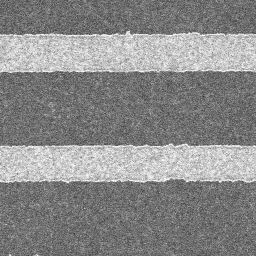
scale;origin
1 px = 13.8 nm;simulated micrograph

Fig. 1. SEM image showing one or a few lines or trenches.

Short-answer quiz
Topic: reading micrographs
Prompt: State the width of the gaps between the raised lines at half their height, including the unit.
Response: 1040 nm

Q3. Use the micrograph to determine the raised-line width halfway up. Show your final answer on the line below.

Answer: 0.488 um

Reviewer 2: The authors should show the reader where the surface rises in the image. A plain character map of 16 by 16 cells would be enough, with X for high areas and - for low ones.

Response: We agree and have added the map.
----------------
----------------
XXXXXXXXXXXXXXXX
XXXXXXXXXXXXXXXX
----------------
----------------
----------------
----------------
----------------
XXXXXXXXXXXXXXXX
XXXXXXXXXXXXXXXX
----------------
----------------
----------------
----------------
----------------